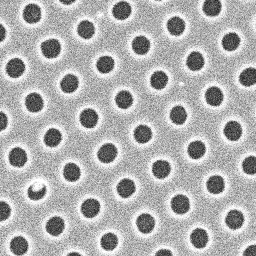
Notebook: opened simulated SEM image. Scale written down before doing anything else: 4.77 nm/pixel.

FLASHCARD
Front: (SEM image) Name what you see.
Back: a regular array of holes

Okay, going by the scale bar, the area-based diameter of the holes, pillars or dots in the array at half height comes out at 0.0957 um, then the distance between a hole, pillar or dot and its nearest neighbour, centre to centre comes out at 0.188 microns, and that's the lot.